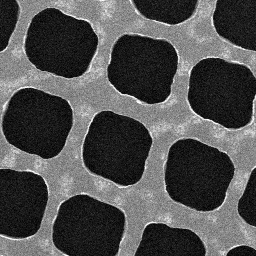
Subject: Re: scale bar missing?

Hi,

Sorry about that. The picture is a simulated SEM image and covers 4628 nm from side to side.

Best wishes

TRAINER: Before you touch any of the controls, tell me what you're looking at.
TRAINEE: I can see holes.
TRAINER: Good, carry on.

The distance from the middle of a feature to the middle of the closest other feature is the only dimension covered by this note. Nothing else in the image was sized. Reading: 1510 nanometres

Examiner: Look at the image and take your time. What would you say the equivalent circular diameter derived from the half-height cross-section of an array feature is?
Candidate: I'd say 1270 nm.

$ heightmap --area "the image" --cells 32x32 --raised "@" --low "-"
--@@@@@@@@@@@@@@@--------@@-----
--@@@---@@@@@@@@@-------@@@-----
--@@------@@@@@@@@@----@@@@-----
--@@--------@@@@@@@@@@@@@@@-----
-@@---------@@@---@@@@@@@@@@----
-@@---------@@-------@@@@@@@@---
@@@---------@@--------@@@@@@@@@@
@@@@-------@@@--------@@@---@@@@
@@@@@------@@---------@@-------@
@@@@@@@---@@@---------@@--------
@@@@@@@@@@@@@@--------@@--------
@@----@@@@@@@@@------@@@--------
@-------@@@@@@@@@----@@@--------
@--------@@@@@@@@@@@@@@@--------
---------@@@----@@@@@@@@@-------
---------@@-------@@@@@@@@@----@
---------@@--------@@@@@@@@@@@@@
@-------@@@--------@@@---@@@@@@@
@@------@@---------@@------@@@@@
@@@@@--@@@--------@@@--------@@@
@@@@@@@@@@@-------@@@--------@@@
----@@@@@@@-------@@@--------@@-
-----@@@@@@@@@----@@@--------@@-
------@@@@@@@@@@@@@@@-------@@@-
------@@@--@@@@@@@@@@-------@@--
------@@------@@@@@@@@@-----@@--
------@--------@@@@@@@@@@@@@@@--
-----@@---------@@@@@@@@@@@@@@--
-----@@---------@@----@@@@@@@@@@
@---@@@--------@@@-------@@@@@@@
@@@@@@@--------@@--------@@@@@@@
@@@@@@@@-------@@---------@@@---